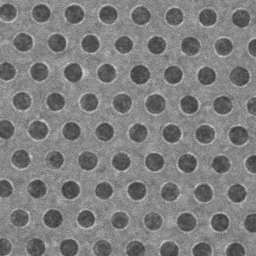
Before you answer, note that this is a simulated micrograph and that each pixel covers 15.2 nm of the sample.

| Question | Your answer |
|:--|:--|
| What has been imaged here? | a regular array of holes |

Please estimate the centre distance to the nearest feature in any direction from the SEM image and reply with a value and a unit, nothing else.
503 nm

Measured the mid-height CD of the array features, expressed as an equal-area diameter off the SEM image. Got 296 nanometres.